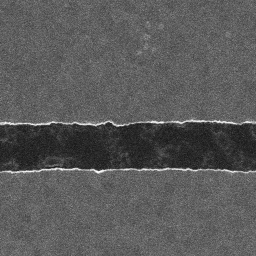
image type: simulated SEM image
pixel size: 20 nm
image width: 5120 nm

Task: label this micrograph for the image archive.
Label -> one or a few lines or trenches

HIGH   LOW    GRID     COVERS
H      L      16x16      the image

HHHHHHHHHHHHHHHH
HHHHHHHHHHHHHHHH
HHHHHHHHHHHHHHHH
HHHHHHHHHHHHHHHH
HHHHHHHHHHHHHHHH
HHHHHHHHHHHHHHHH
HHHHHHHHHHHHHHHH
HHHHHHHHHHHHHHHH
LLLLLLLLLLLLLLLL
LLLLLLLLLLLLLLLL
LLLHLLLLLLLLLLLL
HHHHHHHHHHHHHHHH
HHHHHHHHHHHHHHHH
HHHHHHHHHHHHHHHH
HHHHHHHHHHHHHHHH
HHHHHHHHHHHHHHHH